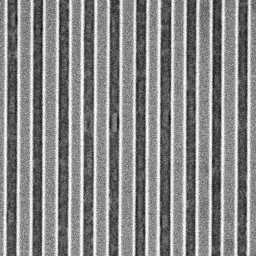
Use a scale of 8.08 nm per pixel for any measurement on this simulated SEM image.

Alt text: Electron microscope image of parallel lines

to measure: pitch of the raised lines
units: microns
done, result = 0.207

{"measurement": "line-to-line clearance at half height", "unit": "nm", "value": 89.9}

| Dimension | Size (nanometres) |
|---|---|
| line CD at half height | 120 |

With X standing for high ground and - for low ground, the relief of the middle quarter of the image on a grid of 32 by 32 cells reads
-XXXX---XXX---XXXX---XXX---XXX--
-XXXX---XXX---XXXX---XXX---XXX--
-XXXX---XXX---XXXX---XXX---XXX--
-XXXX---XXX---XXXX---XXX---XXX--
-XXXX---XXX---XXXX---XXX---XXX--
-XXXX---XXX---XXXX---XXX---XXX--
-XXXX---XXX---XXXX---XXX---XXX--
-XXXX---XXX---XXXX---XXX---XXX--
-XXXX---XXX---XXXX---XXX---XXX--
-XXXX---XXX---XXXX---XXX---XXX--
-XXXX---XXX---XXXX---XXX---XXX--
-XXXX---XXX---XXXX---XXX---XXX--
-XXXX---XXX---XXXX---XXX---XXX--
-XXXX---XXX---XXXX---XXX---XXX--
-XXXX---XXX---XXXX---XXX---XXX--
-XXXX---XXX---XXXX---XXX---XXX--
-XXXX---XXX---XXXX---XXX---XXX--
-XXXX---XXX---XXXX---XXX---XXX--
-XXXX---XXX---XXXX---XXX---XXX--
-XXXX---XXX---XXXX---XXX---XXX--
-XXXX---XXX---XXXX---XXX---XXX--
-XXXX---XXX---XXXX---XXX---XXX--
-XXXX---XXX---XXXX---XXX---XXX--
-XXXX---XXX---XXXX---XXX---XXX--
-XXXX---XXX---XXXX---XXX---XXX--
-XXXX---XXX---XXXX---XXX---XXX--
-XXXX---XXX---XXXX---XXX---XXX--
-XXXX---XXX---XXXX---XXX---XXX--
-XXXX---XXX---XXXX---XXX---XXX--
-XXXX---XXX---XXXX---XXX---XXX--
-XXXX---XXX---XXXX---XXX---XXX--
-XXXX---XXX---XXXX---XXX---XXX--